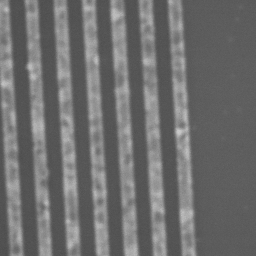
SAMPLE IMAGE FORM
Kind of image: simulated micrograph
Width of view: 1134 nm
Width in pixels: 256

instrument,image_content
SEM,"parallel lines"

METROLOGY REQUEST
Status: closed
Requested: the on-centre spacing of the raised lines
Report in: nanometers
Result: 127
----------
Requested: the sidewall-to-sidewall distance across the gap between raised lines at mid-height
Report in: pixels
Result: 18.7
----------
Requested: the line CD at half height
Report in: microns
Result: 0.0459